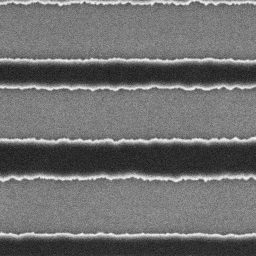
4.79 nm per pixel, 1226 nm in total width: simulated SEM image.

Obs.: lines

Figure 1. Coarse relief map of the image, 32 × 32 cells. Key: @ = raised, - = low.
-------@---------@@---@---------
--------------------------------
--------------------------------
--------------------------------
--------------------------------
--------------------------------
--------------------------------
@@@@-@@@@@-@@@@@@@@@--@@@@@@@---
@@@@@@@@@@@@@@@@@@@@@@@@@@@@@@@@
@@@@@@@@@@@@@@@@@@@@@@@@@@@@@@@@
@@@@@@@@@@@@@@@@@@@@@@@@@@@@@@@@
--------------------------------
--------------------------------
--------------------------------
--------------------------------
--------------------------------
--------------------------------
@@@@@--@@----@-@---@@@@-@@@@@@@@
@@@@@@@@@@@@@@@@@@@@@@@@@@@@@@@@
@@@@@@@@@@@@@@@@@@@@@@@@@@@@@@@@
@@@@@@@@@@@@@@@@@@@@@@@@@@@@@@@@
@@@@@@@@@@@@@@@@@@@@@@@@@@@@@@@@
@--------------------@@---------
--------------------------------
--------------------------------
--------------------------------
--------------------------------
--------------------------------
--------------------------------
@@@@@@@@@@@@@@@@@@@@@@@@@@@@@@@@
@@@@@@@@@@@@@@@@@@@@@@@@@@@@@@@@
@@@@@@@@@@@@@@@@@@@@@@@@@@@@@@@@